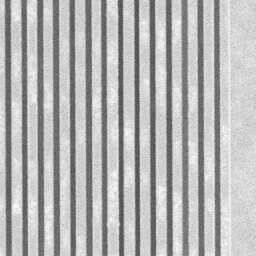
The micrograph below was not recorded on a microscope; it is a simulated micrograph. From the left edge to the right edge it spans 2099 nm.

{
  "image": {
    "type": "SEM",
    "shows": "parallel lines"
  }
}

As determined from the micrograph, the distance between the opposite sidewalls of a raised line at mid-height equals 0.0841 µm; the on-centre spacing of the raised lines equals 132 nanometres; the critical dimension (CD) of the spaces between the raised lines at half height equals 49.2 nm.